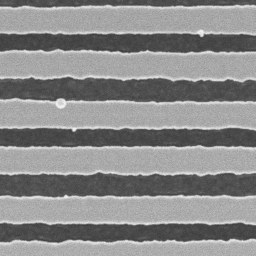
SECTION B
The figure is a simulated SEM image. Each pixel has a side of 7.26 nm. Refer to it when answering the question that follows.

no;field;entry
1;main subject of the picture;lines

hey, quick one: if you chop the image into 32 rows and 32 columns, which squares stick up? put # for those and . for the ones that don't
................................
################################
################################
################################
................................
................................
##############....#......##.....
################################
################################
################################
................................
................................
#####..#........................
################################
################################
################################
................................
................................
################################
################################
################################
################################
................................
................................
......................#.#..##...
################################
################################
################################
................................
................................
################################
################################